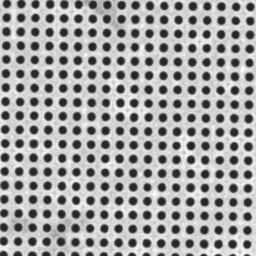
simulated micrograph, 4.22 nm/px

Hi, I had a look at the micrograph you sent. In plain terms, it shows a regular array of holes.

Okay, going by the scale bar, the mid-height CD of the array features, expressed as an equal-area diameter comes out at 35.7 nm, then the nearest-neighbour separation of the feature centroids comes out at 58.2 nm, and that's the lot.